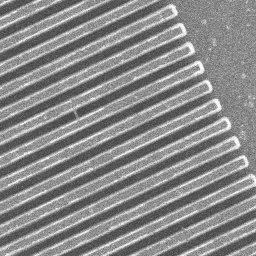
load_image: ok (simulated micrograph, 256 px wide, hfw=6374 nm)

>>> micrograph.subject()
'parallel lines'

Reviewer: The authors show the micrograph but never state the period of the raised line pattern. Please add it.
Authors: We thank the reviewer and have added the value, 517 nm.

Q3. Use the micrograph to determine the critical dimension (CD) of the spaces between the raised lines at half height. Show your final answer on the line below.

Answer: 9.59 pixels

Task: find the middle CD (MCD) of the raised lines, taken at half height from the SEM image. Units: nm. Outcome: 284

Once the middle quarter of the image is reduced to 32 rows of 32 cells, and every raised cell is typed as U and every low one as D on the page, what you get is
UDDDDDDUUUUUUDDDDDDUUUUUUUDDDDDU
DDDDDUUUUUUDDDDDDUUUUUUUDDDDDUUU
DDDUUUUUUDDDDDDUUUUUUDDDDDDUUUUU
DUUUUUUDDDDDDUUUUUUDDDDDDUUUUUUU
UUUUUDDDDDDUUUUUUDDDDDDUUUUUUDDD
UUUDDDDDDUUUUUUDDDDDUUUUUUUDDDDD
UDDDDDUUUUUUUDDDDDUUUUUUUDDDDDDU
DDDDDUUUUUUDDDDDUUUUUUUDDDDDUUUU
DDUUUUUUUDDDDDUUUUUUUDDDDDUUUUUU
UUUUUUUDDDDDUUUUUUUDDDDDUUUUUUUD
UUUUUDDDDDUUUUUUUDDDDDUUUUUUUDDD
UUUDDDDDUUUUUUUDDDDDUUUUUUUDDDDD
DDDDDDUUUUUUUDDDDDUUUUUUUDDDDDUU
DDDUUUUUUUUDDDDDUUUUUUUDDDDDUUUU
DDUUUUUUDDDDDDUUUUUUUDDDDDUUUUUU
UUUUUUDDDDDDUUUUUUUDDDDDUUUUUUDD
UUUUDDDDDDUUUUUUDDDDDDUUUUUUDDDD
UUDDDDDUUUUUUUDDDDDDUUUUUUDDDDDD
DDDDDUUUUUUUDDDDDDUUUUUUDDDDDDUU
DDDUUUUUUUDDDDDUUUUUUUDDDDDDUUUU
DUUUUUUUDDDDDUUUUUUUDDDDDDUUUUUU
UUUUUUDDDDDUUUUUUUDDDDDUUUUUUUDD
UUUUDDDDDUUUUUUDDDDDDUUUUUUUDDDD
UUDDDDDUUUUUUDDDDDDUUUUUUUDDDDDU
DDDDDUUUUUUDDDDDDUUUUUUDDDDDDUUU
DDDUUUUUUDDDDDDUUUUUUDDDDDDUUUUU
DUUUUUUDDDDDDUUUUUUDDDDDDUUUUUUD
UUUUUDDDDDDUUUUUUDDDDDDUUUUUUDDD
UUUDDDDDDUUUUUUDDDDDDUUUUUUDDDDD
UDDDDDDUUUUUUDDDDDDUUUUUUDDDDDDU
DDDDDUUUUUUDDDDDDUUUUUUDDDDDDUUU
DDUUUUUUUDDDDDDUUUUUUDDDDDDUUUUU